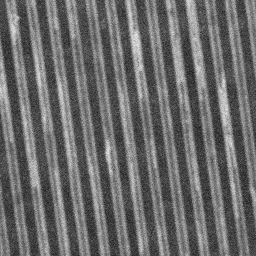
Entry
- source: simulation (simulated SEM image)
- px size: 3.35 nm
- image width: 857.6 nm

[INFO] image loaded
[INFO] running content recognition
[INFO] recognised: parallel lines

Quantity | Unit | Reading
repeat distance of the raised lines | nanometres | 66.2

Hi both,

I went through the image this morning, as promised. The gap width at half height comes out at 39.4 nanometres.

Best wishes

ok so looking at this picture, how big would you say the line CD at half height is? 0.027 µm